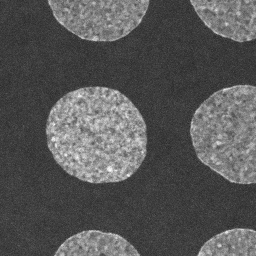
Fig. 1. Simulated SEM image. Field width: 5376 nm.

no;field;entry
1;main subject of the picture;raised bodies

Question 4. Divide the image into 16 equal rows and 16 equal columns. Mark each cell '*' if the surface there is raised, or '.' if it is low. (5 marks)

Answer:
...******...****
....*****....***
......*........*
................
................
..............**
.............***
............****
............****
............****
.............***
................
................
................
.....*........**
....****.....***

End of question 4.